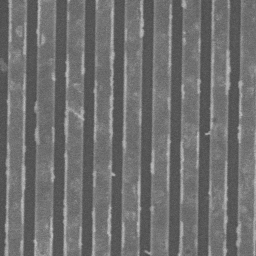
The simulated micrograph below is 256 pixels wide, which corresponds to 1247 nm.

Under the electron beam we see parallel lines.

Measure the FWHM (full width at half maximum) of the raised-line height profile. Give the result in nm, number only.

90.6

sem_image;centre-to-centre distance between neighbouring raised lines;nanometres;141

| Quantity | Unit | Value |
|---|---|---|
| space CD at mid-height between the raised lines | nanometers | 52.9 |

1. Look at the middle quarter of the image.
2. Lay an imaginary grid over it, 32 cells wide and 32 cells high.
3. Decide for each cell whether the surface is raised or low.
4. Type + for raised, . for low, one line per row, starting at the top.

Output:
.++++...++++...++++...+++++...++
.++++...++++...++++...+++++..+++
+++++...++++...++++...+++++..+++
+++++...++++...++++...+++++...++
.++++...++++...++++...++++...+++
.++++...++++...++++...++++...+++
.++++...++++...++++...++++...+++
.++++...++++...++++...++++...+++
.++++...++++...++++...+++++..+++
.++++...++++...++++...++++....++
.++++...++++...++++...++++...+++
+++++...++++...++++...++++...+++
+++++...++++...++++...++++...+++
+++++...++++...++++...++++...+++
+++++...++++...++++...++++...+++
+++++...++++...++++...++++...+++
+++++...++++...++++...++++...+++
+++++...++++...++++...++++....++
+++++...++++...++++...++++...+++
+++++...++++...++++...+++++..+++
+++++...++++...++++...++++...+++
+++++...++++...++++...++++...+++
+++++...++++...++++...++++...+++
+++++...++++...++++...++++...+++
+++++..+++++...++++...++++...+++
+++++..+++++...++++...++++...+++
+++++..+++++...++++...++++...+++
++++...+++++...++++...++++...+++
++++...+++++...++++...++++...+++
++++...+++++...++++...++++...+++
++++...+++++...++++...++++...+++
++++...+++++...++++...++++...+++